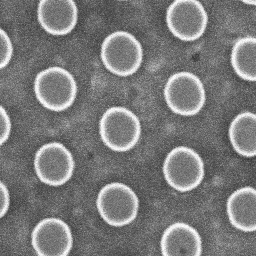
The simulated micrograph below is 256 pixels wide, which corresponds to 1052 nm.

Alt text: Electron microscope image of raised bodies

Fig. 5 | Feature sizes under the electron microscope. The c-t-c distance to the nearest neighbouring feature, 0.307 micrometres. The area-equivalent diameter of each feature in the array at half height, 162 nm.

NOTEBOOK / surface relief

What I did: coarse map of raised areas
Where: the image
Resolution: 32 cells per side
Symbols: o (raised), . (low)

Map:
.....oooo.............ooo.......
.....oooo............oooo.......
.....oooo............ooooo......
......ooo............oooo.......
o.............oo......ooo.......
o............oooo.............oo
o............ooooo...........ooo
o............oooo............ooo
..............ooo............ooo
.....oooo.............oo......oo
.....oooo............oooo.......
.....oooo............oooo.......
.....oooo............oooo.......
......oo..............ooo.......
o............oooo.............oo
o............oooo............ooo
o............oooo............ooo
.............oooo............ooo
.....ooo......oo.............ooo
.....oooo............oooo.......
....ooooo............oooo.......
.....oooo............oooo.......
.....ooo.............oooo.......
.............ooo......oo........
o...........ooooo............ooo
o...........ooooo............ooo
.............oooo............ooo
......o......ooo.............ooo
.....ooo.............ooo......oo
....ooooo............oooo.......
....ooooo...........ooooo.......
.....ooo............ooooo.......